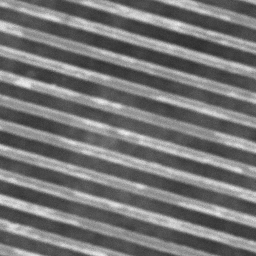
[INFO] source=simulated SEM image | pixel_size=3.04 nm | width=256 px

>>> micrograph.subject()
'parallel lines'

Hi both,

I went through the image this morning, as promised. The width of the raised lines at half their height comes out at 0.0259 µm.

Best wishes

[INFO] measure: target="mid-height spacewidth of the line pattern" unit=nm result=46.4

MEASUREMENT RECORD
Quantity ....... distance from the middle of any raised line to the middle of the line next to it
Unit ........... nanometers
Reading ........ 72.6